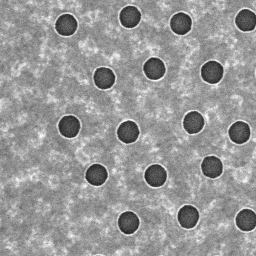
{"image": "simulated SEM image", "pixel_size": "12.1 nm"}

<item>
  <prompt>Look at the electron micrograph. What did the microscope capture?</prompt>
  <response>a regular array of holes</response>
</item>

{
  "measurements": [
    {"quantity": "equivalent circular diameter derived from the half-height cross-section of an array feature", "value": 279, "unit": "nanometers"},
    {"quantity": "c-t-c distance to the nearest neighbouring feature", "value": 625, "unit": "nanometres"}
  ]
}